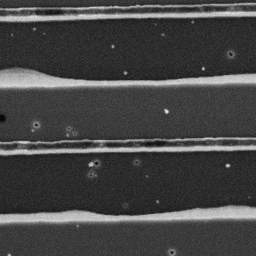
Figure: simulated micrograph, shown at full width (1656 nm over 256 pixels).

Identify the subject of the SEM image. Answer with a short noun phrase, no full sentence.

lines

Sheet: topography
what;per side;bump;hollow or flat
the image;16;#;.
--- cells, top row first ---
################
................
................
................
................
################
################
################
################
................
................
................
................
............####
################
################